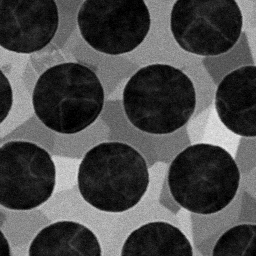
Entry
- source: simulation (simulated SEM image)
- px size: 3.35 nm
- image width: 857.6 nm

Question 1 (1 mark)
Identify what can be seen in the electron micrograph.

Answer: holes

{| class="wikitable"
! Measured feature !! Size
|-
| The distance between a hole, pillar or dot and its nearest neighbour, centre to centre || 90.6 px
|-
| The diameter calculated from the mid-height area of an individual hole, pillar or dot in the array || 240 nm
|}